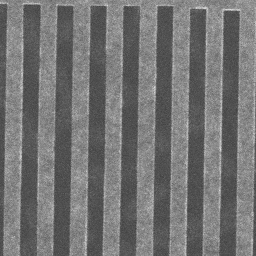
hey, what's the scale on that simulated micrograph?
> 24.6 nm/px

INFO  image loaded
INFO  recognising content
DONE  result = parallel lines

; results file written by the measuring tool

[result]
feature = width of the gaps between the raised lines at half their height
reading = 419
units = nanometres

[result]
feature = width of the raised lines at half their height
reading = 391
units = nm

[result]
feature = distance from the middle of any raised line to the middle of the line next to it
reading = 820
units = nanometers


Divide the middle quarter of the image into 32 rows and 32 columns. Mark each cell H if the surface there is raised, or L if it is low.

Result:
LLHHHHLLLLLHHHLLLLLHHHHLLLLHHHHL
LLHHHHLLLLLHHHLLLLLHHHHLLLLHHHHL
LLHHHHLLLLLHHHLLLLLHHHHLLLLHHHHL
LLHHHHLLLLLHHHLLLLLHHHHLLLLHHHHL
LLHHHHLLLLLHHHLLLLLHHHHLLLLHHHHL
LLHHHHLLLLLHHHLLLLLHHHHLLLLHHHHL
LLHHHHLLLLLHHHLLLLLHHHHLLLLHHHHL
LLHHHHLLLLLHHHLLLLLHHHHLLLLHHHHL
LLHHHHLLLLLHHHLLLLLHHHHLLLLHHHHL
LLHHHHLLLLLHHHLLLLLHHHHLLLLHHHHL
LLHHHHLLLLLHHHLLLLLHHHHLLLLHHHHL
LLHHHHLLLLLHHHLLLLLHHHHLLLLHHHHL
LLHHHHLLLLLHHHLLLLLHHHHLLLLHHHHL
LLHHHHLLLLLHHHLLLLLHHHHLLLLHHHHL
LLHHHHLLLLHHHHLLLLLHHHHLLLLHHHHL
LLHHHHLLLLHHHHLLLLLHHHHLLLLHHHHL
LLHHHHLLLLHHHHLLLLLHHHHLLLLHHHHL
LLHHHHLLLLHHHHLLLLLHHHHLLLLHHHHL
LLHHHHLLLLHHHHLLLLLHHHHLLLLHHHHL
LLHHHHLLLLLHHHLLLLLHHHHLHLLHHHHL
LLHHHHLLLLHHHHLLLLLHHHLLLHLHHHHL
LLHHHHLLLLHHHHLLLLLHHHLLLLLHHHHL
LLHHHHLLLLHHHHLLLLLHHHLLLLLHHHHL
LLHHHHLLLLHHHHLLLLLHHHLLLLLHHHHL
LLHHHHLLLLHHHHLLLLLHHHLLLLLHHHHL
LLHHHHLLLLLHHHLLLLLHHHLLLLLHHHHL
LLHHHHLLLLHHHHLLLLLHHHLLLLLHHHHL
LLHHHHLLLLHHHHLLLLLHHHLLLLLHHHHL
LLHHHHLLLLHHHHLLLLLHHHLLLLLHHHHL
LLHHHHLLLLHHHHLLLLHHHHLLLLLHHHHL
LLHHHHLLLLHHHHLLLLHHHHLLLLLHHHHL
LLHHHHLLLLHHHHLLLLHHHHLLLLLHHHHL